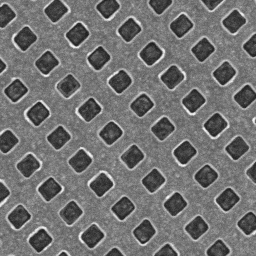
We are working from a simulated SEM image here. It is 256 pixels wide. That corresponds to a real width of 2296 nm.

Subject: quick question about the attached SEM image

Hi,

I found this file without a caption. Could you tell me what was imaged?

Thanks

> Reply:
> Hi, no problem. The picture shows a regular array of holes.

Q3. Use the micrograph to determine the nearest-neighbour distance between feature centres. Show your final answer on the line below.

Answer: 285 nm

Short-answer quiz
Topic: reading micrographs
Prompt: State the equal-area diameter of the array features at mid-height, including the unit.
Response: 192 nm